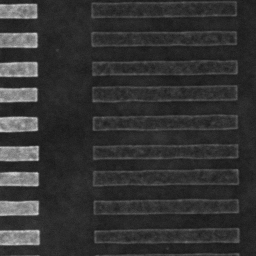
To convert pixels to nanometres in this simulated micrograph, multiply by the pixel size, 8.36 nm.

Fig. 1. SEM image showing wiring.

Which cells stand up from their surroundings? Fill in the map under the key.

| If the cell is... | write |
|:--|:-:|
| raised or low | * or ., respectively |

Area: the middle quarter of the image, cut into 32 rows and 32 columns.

.......*************************
.......*************************
.......*************************
................................
................................
................................
.......*************************
.......*************************
.......*************************
................................
................................
................................
................................
.......*************************
.......*************************
.......*************************
................................
................................
................................
................................
............********************
.......*************************
.......*************************
.......*********************...*
................................
................................
................................
.......*************************
.......*************************
.......*************************
................................
................................